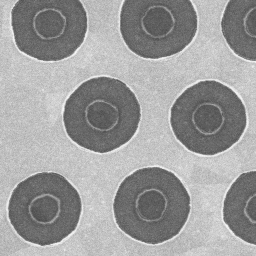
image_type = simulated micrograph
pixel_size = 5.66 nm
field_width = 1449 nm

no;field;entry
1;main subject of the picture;ring-shaped grooves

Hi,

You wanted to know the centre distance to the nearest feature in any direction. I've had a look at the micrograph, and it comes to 0.589 µm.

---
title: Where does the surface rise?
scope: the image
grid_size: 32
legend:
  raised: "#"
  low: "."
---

##........#####.........####....
#....##....####...###....###...#
#...####...####...####...###...#
#...####...####...####...###...#
##...##....####....#....####...#
##........######........####....
###......########.....#######...
#####...#######################.
################################
################################
##########......########....####
#########........######......###
########.........#####........##
########...###....###....##....#
########...####...###...####...#
########...###...####...####...#
########.........#####...##...##
#########.......######........##
##########.....########......###
################################
################################
#####.###########.....#########.
###......######........######...
##.......######........######...
#....##...####...###....####....
#...###...####...####...####...#
#...###...####...###....####...#
#....##...####....##...#####...#
##........#####........######...
##.......#######......#######...
####...###########..###########.
################################